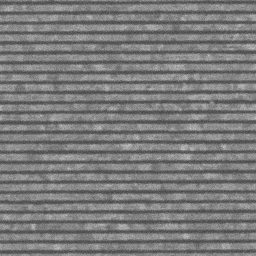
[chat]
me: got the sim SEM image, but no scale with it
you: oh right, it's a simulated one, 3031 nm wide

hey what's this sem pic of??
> parallel lines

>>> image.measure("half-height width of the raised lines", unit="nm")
68.1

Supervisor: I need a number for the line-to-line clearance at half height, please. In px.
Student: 4.38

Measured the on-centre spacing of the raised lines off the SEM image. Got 0.118 µm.